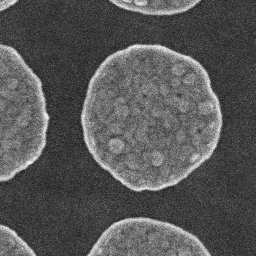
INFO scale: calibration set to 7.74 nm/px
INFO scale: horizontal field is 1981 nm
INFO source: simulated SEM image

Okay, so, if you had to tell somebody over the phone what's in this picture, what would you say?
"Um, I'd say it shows raised bodies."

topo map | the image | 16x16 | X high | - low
--------XXXX----
----------------
----------------
X------XXXX-----
XX----XXXXXXX---
XX----XXXXXXX---
XXX--XXXXXXXXX--
XXX--XXXXXXXXX--
XXX--XXXXXXXXX--
XX----XXXXXXX---
X------XXXXX----
--------XXX-----
----------------
----------------
X------XXXX-----
XX----XXXXXXX---